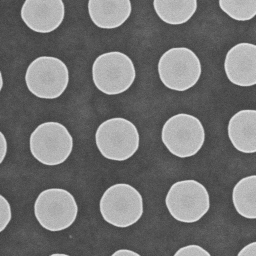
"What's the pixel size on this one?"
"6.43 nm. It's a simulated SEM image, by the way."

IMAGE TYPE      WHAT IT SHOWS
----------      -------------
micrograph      an array of small figures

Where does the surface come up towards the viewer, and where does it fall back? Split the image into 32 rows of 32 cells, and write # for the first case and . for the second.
...#####...#####...######..#####
...#####...#####....####....####
...#####....####....###.........
....###......#..................
................................
..............................#.
.....................###.....###
....###.....####....#####...####
....####....#####...#####...####
...#####....#####...#####...####
...#####....####.....###.....###
....####.....##.................
................................
................................
......................##.....###
.....###.....####....####....###
....#####...#####...######...###
#...#####...#####...#####....###
#...#####...#####....####.....##
#...#####....###......##........
......#.........................
................................
..............................##
..............###....#####...###
.....####....#####...#####...###
#...#####....#####...#####...###
#...######...#####...#####....##
#....####....####.....###.......
#.....##........................
................................
...............................#
...............##.....####....##